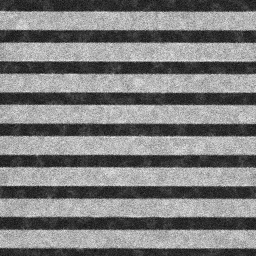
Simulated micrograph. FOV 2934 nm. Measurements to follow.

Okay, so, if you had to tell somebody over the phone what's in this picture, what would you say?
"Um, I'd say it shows parallel lines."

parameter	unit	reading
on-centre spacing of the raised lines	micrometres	0.357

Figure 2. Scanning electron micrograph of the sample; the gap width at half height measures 155 nanometres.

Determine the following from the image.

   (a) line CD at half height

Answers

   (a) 0.203 um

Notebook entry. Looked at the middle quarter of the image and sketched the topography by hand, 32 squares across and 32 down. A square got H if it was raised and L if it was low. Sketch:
LLLLLLLLLLLLLLLLLLLLLLLLLLLLLLLL
LLLLLLLLLLLLLLLLLLLLLLLLLLHLLLLL
LLLLLLLLLLLLLLLLLLLLLLLLLLHLLLLL
HHHHHHHHHHHHHHHHHHHHHHHHHHHHHHHH
HHHHHHHHHHHHHHHHHHHHHHHHHHHHHHHH
HHHHHHHHHHHHHHHHHHHHHHHHHHHHHHHH
HHHHHHHHHHHHHHHHHHHHHHHHHHHHHHHH
LLLLLLLLLLLLLLLLLLLLLLLLLLLLLLLL
LLLLLLLLLLLLLLLLLLLLLLLLLLLLLLLL
LLLLLLLLLLLLLLLLLLLLLLLLLLLLLLLL
LLLLLLLLLLLLLLLLLLLLLLLLLLLLLLLL
HHHHHHHHHHHHHHHHHHHHHHHHHHHHHHHH
HHHHHHHHHHHHHHHHHHHHHHHHHHHHHHHH
HHHHHHHHHHHHHHHHHHHHHHHHHHHHHHHH
HHHHHHHHHHHHHHHHHHHHHHHHHHHHHHHH
LLLLLLLLLLLLLLLLLLLLLLLLLLLLLLLL
LLLLLLLLLLLLLLLLLLLLLLLLLLLLLLLL
LLLLLLLLLLLLLLLLLLLLLLLLLLLLLLLL
HHHHHHHHHHHHHHHHHHHHHHHHHHHHHHHH
HHHHHHHHHHHHHHHHHHHHHHHHHHHHHHHH
HHHHHHHHHHHHHHHHHHHHHHHHHHHHHHHH
HHHHHHHHHHHHHHHHHHHHHHHHHHHHHHHH
HHHHHHHHHHHHHHHHHHHHHHHHHHHHHHHH
LLLLLLLLLLLLLLLLLLLLLLLLLLLLLLLL
LLLLLLLLLLLLLLLLLLLLLLLLLLLLLLLL
LLLLLLLLLLLLLLLLLLLLLLLLLLLLLLLL
HHHHHHHHHHHHHHHHHHHHHHHHHHHHHHHH
HHHHHHHHHHHHHHHHHHHHHHHHHHHHHHHH
HHHHHHHHHHHHHHHHHHHHHHHHHHHHHHHH
HHHHHHHHHHHHHHHHHHHHHHHHHHHHHHHH
LLLLLLLLLLLLLLLLLLLLLLLLLLLLLLLL
LLLLLLLLLLLLLLLLLLLLLLLLLLLLLLLL